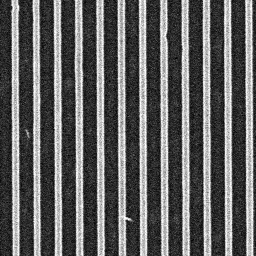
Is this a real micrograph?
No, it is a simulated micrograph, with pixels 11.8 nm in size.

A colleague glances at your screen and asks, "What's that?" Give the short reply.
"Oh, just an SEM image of parallel lines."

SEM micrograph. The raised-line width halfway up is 69.1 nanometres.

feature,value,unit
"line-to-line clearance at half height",182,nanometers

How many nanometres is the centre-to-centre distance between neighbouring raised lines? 250